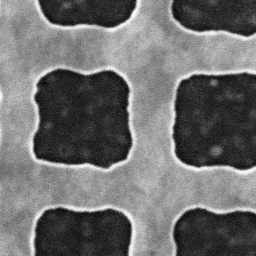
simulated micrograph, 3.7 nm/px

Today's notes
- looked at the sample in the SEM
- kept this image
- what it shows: holes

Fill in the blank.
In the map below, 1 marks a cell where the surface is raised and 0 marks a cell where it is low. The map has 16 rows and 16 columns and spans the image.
1100000011100000
1110000011100000
1111111111111111
1111111111111111
1110010111111111
1100000011100000
1100000011100000
1100000011100000
1100000011100000
1100000011100000
1111110111111100
1111111111111111
1111111111111111
1100000011100000
1100000011100000
1100000011100000